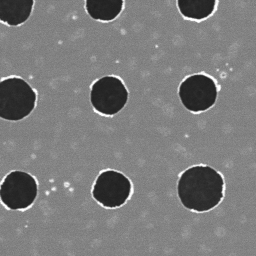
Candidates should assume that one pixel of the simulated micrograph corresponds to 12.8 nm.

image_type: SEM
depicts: holes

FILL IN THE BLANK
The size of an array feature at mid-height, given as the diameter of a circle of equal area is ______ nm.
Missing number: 479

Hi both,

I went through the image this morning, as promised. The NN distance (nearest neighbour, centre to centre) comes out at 1140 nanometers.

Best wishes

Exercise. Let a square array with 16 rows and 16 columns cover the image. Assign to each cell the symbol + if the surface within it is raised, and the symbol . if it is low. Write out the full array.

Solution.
..+++...+++..+++
++++++++++++++++
++++++++++++++++
++++++++++++++++
++++++++++++++++
..++++..+++..+++
..++++..+++..+++
++++++++++++++++
++++++++++++++++
++++++++++++++++
++++++++++++.+++
..++++..+++...++
..++++..+++...++
++++++++++++++++
++++++++++++++++
++++++++++++++++